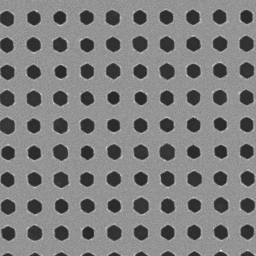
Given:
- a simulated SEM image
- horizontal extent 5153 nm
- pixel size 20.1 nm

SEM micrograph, a regular array of holes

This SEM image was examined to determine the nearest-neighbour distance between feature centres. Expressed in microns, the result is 0.53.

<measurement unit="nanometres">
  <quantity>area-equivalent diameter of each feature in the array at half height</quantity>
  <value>295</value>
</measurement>